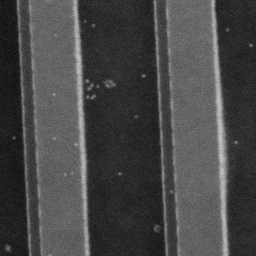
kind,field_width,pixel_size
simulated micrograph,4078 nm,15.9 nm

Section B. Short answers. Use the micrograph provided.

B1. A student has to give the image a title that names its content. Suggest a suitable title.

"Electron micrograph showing lines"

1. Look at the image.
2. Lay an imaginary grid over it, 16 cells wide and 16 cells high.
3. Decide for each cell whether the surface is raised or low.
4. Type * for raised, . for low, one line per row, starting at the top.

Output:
.****.....***...
.****.....***...
.****.....***...
.****.....***...
.****.....***...
.****.....****..
.****.....****..
.****.....****..
..***.....****..
..***.....****..
..***.....****..
..***.....****..
..***.....****..
..***.....****..
..***.....****..
..***.....****..